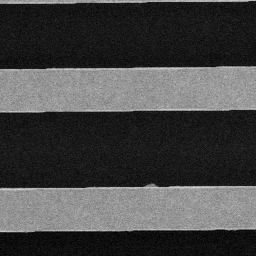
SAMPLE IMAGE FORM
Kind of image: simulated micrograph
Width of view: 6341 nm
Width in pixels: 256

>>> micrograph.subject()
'lines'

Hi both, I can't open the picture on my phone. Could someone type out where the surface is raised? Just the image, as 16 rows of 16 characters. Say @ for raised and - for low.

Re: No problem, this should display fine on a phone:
----------------
----------------
----------------
----------------
@@@@@@@@@@@@@@@@
@@@@@@@@@@@@@@@@
@@@@@@@@@@@@@@@@
----------------
----------------
----------------
----------------
----------------
@@@@@@@@@@@@@@@@
@@@@@@@@@@@@@@@@
----------------
----------------